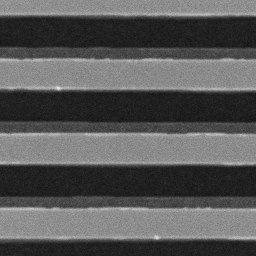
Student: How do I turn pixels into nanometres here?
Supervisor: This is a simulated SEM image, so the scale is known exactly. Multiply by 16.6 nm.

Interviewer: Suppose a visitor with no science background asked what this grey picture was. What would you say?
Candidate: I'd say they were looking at lines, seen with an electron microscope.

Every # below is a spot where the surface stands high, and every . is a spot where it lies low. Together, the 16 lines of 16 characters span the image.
################
................
................
################
################
################
................
................
################
################
................
................
################
################
################
................